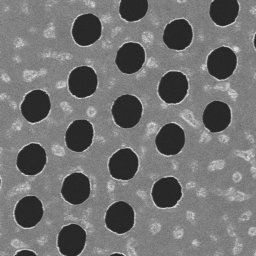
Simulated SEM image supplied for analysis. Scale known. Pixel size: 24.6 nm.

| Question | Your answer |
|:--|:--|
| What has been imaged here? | a regular array of holes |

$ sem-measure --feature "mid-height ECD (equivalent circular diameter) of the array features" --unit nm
766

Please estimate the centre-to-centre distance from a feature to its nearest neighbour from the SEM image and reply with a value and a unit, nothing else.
1280 nanometres